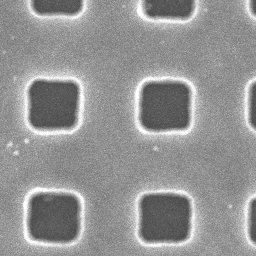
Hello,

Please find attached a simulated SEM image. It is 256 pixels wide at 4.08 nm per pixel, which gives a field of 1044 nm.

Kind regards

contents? holes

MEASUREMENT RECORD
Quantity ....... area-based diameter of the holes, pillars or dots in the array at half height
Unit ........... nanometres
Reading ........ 224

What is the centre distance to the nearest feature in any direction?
111 px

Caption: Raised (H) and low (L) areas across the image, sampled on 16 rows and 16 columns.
HHLLLHHHHLLLHHHH
HHHHHHHHHHHHHHHH
HHHHHHHHHHHHHHHH
HHHHHHHHHHHHHHHH
HHHHHHHHHHHHHHHH
HHLLLHHHHLLLHHHH
HHLLLHHHHLLLHHHH
HHLLLHHHHLLLHHHH
HHHHHHHHHHHHHHHH
HHHHHHHHHHHHHHHH
HHHHHHHHHHHHHHHH
HHHHHHHHHHHHHHHH
HHLLLHHHHLLLHHHH
HHLLLHHHHLLLHHHH
HHLLLHHHHLLLHHHH
HHHHHHHHHHHHHHHH